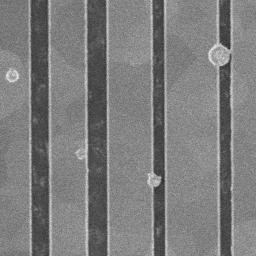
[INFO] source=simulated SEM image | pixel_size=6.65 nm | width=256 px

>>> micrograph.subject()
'one or a few lines or trenches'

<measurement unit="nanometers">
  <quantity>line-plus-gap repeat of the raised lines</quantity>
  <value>413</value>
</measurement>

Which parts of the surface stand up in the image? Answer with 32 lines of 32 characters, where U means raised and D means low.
UUUUDDUUUUUDDUUUUUUDDUUUUUUDDUUU
UUUUDDUUUUUDDUUUUUUDDUUUUUUDDUUU
UUUUDDUUUUUDDUUUUUUDDUUUUUUDDUUU
UUUUDDUUUUUDDUUUUUUDDUUUUUUDDUUU
UUUUDDUUUUUDDUUUUUUDDUUUUUUDDUUU
UUUUDDUUUUUDDUUUUUUDDUUUUUUUDUUU
UUUUDDUUUUUDDDUUUUUDDUUUUUUUUUUU
UUUUDDUUUUUDDDUUUUUDDUUUUUUUUUUU
UUUUDDUUUUUDDDUUUUUDDUUUUUUDDUUU
UUUUDDUUUUUDDDUUUUUDDUUUUUUDDUUU
UUUUDDUUUUUDDDUUUUUDDUUUUUUDDUUU
UUUUDDUUUUUDDDUUUUUDDUUUUUUDDUUU
UUUUDDUUUUUDDDUUUUUDDUUUUUUDDUUU
UUUUDDUUUUUDDDUUUUUDDUUUUUUDDUUU
UUUUDDUUUUUDDDUUUUUDDUUUUUUDDUUU
UUUUDDUUUUUDDDUUUUUDDUUUUUUDDUUU
UUUUDDUUUUUDDDUUUUUDDUUUUUUDDUUU
UUUUDDUUUUUDDDUUUUUDDUUUUUUDDUUU
UUUUDDUUUUUDDDUUUUUDDUUUUUUDDUUU
UUUUDDUUUUUDDDUUUUUDDUUUUUUDDUUU
UUUUDDUUUUUDDDUUUUUDDUUUUUUDDUUU
UUUUDDUUUUUDDDUUUUUDDUUUUUUDDUUU
UUUUDDUUUUUDDDUUUUUUDUUUUUUDDUUU
UUUUDDUUUUUDDDUUUUUDDUUUUUUDDUUU
UUUUDDUUUUUDDDUUUUUDDUUUUUUDDUUU
UUUUDDUUUUUDDDUUUUUDDUUUUUUDDUUU
UUUUDDUUUUUDDDUUUUUDDUUUUUUDDUUU
UUUUDDUUUUUDDDUUUUUDDUUUUUUDDUUU
UUUUDDUUUUUDDDUUUUUDDUUUUUUDDUUU
UUUUDDUUUUUDDDUUUUUDDUUUUUUDDUUU
UUUUDDUUUUUDDDUUUUUDDUUUUUUDDUUU
UUUUDDUUUUUDDDUUUUUDDUUUUUUDDUUU